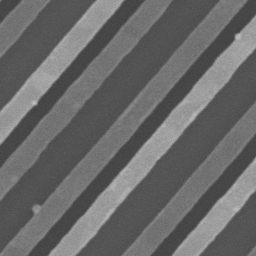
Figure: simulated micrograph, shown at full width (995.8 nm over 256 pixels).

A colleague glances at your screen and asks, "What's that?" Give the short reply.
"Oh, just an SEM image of lines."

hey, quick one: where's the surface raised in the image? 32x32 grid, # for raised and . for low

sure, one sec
..####......###...###......####.
.####......###...###......####..
####......###...####.....####..#
###......####..####......###...#
##......####..####......###...##
##.....####...###......###...###
#......###...###......###...###.
......###...###......###...####.
.....###...###......####..####..
....###...###......####..####...
...####..####.....####...###....
..####..####......###...###.....
.####..####......###...###......
####...###......###...###......#
###...###......###...####.....##
##...###......####..####......##
#...###......####..####......###
...###......####...###......###.
..####......###...###......###..
.####......###...###......####..
.###......###...###......####..#
###......###...####.....####..##
##......####..####.....####...##
#......####..####......###...###
......####..####......###...###.
.....####...###......###...###..
....####...###......####..####..
....###...###......####..####...
...###...###......####..####....
..####..####.....####...###.....
.####..####......###...###......
####..####......###...###......#